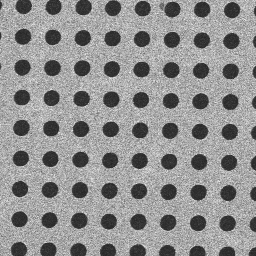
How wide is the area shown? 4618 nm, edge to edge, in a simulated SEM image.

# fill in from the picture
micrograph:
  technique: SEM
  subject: a regular array of holes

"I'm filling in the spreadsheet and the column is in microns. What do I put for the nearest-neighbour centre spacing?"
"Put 0.533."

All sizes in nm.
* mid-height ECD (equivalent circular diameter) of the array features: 289